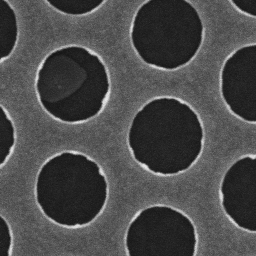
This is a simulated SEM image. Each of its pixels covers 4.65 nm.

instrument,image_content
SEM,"holes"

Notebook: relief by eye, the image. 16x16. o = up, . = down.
.ooo..ooo...ooo.
.ooooooo.....ooo
.ooooooo.....ooo
ooo...ooo...ooo.
ooo....ooooooo..
oo.....ooooooo..
ooo...ooo..ooo..
.ooo.ooo....oooo
.ooooooo.....ooo
.ooooooo....oooo
ooo...ooo...oo..
oo.....ooooooo..
oo.....ooooooo..
ooo...ooo..ooo..
.ooooooo....oooo
.ooooooo....oooo